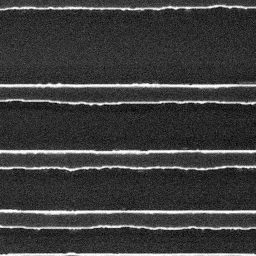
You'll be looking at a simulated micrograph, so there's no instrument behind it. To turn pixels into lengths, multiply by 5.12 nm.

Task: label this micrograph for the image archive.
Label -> lines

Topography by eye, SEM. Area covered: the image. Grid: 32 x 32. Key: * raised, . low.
********************************
................................
................................
................................
................................
................................
................................
................................
................................
................................
................................
********************************
********************************
................................
................................
................................
................................
................................
................................
********************************
********************************
................................
................................
................................
................................
................................
*****......**********..****.****
********************************
....*...**........*****..*******
................................
................................
................................